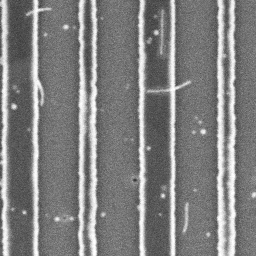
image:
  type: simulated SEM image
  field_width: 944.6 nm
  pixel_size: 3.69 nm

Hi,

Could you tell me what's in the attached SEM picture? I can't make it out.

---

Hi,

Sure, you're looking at lines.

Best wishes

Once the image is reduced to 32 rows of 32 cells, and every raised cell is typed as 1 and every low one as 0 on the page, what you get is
11111000001100000011110000011000
01111000001100000011110000011000
11111000001100000111110000011000
01111000001100000011110000011000
11111000001100000011110000011000
01111000001100000011110000011000
01111000001100000011110000011000
01111000001100000011110000011000
01111000001100000011110000011000
01111000001100000011110000011000
01111000001100000011110000011000
01111000001100000011110000011000
11111000001100000011110000011000
11111000001100000011110000011000
01111000001100000011110000011000
01111000001100000011110000011000
01111000001100000011110000011000
11111000001100000011110000011000
11111000001100000011110000011000
01111000001100000011110000011000
01111000001100000011110000011000
01111000001100000011110000011000
01111000001100000011110000011000
11111000001100000011110000011000
01111000001100000011110000011000
01111000001100000011110000011000
11111000001100000011110000001000
11111000001100000011110000011000
01111000001100000011110000011000
01111000001100000011110000001000
01111000001100000011110000011000
01111000001100000011110000011000